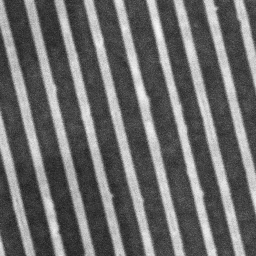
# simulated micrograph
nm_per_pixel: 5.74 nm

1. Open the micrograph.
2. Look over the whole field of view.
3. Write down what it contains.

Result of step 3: parallel lines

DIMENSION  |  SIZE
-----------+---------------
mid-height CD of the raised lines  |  43.9 nm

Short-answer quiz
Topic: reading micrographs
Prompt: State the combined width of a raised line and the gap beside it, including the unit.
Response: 29.1 pixels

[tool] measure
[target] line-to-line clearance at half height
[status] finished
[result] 121 nm